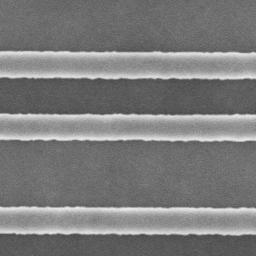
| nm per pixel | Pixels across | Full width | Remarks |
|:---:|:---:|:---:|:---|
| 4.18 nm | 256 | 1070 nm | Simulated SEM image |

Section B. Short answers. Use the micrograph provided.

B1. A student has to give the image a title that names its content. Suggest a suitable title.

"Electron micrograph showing lines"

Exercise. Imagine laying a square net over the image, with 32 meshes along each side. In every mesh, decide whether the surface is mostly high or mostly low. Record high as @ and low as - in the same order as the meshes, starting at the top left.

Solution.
--------------------------------
--------------------------------
--------------------------------
--------------------------------
--------------------------------
--------------------------------
@@@@@@@@@-----@----@------------
@@@@@@@@@@@@@@@@@@@@@@@@@@@@@@@@
@@@@@@@@@@@@@@@@@@@@@@@@@@@@@@@@
@@@@@@@@@@@@@@@@@@@@@@@@@@@@@@@@
--------------------------------
--------------------------------
--------------------------------
--------------------------------
@@@@@@@@@@@@@@@@@@@@@@--@@-@@@@@
@@@@@@@@@@@@@@@@@@@@@@@@@@@@@@@@
@@@@@@@@@@@@@@@@@@@@@@@@@@@@@@@@
---------------------@-@-@@--@@-
--------------------------------
--------------------------------
--------------------------------
--------------------------------
--------------------------------
--------------------------------
--------------------------------
--------------------------------
@@@@@@@@@@@@@@@@@@@@@@@@@@@@@@@@
@@@@@@@@@@@@@@@@@@@@@@@@@@@@@@@@
@@@@@@@@@@@@@@@@@@@@@@@@@@@@@@@@
--------------------------------
--------------------------------
--------------------------------